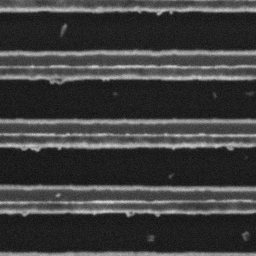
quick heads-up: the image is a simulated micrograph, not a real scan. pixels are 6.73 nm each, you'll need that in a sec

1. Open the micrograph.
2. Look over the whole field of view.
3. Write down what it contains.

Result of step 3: lines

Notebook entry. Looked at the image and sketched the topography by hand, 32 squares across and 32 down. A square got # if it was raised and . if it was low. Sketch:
################################
...................#............
................................
................................
................................
................................
................................
################################
################################
################################
................................
................................
................................
................................
................................
################################
################################
################################
...##.......................#...
................................
................................
................................
................................
###.##..##......................
################################
################################
################################
................................
................................
................................
................................
................................